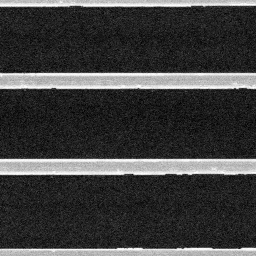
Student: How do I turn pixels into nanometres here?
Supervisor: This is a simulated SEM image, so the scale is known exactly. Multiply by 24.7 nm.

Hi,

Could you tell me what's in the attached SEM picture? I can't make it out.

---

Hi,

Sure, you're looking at lines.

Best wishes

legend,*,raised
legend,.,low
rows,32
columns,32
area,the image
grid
********************************
................................
................................
................................
................................
................................
................................
................................
................................
********************************
********************************
................................
................................
................................
................................
................................
................................
................................
................................
................................
********************************
********************************
................................
................................
................................
................................
................................
................................
................................
................................
................................
********************************